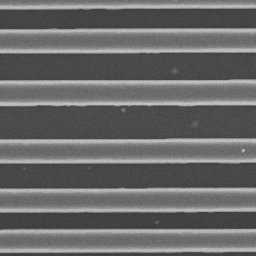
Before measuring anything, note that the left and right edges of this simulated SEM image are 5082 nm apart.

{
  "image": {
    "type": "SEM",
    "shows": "lines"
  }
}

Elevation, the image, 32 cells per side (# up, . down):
################################
................................
................................
................................
################################
################################
################################
................................
................................
................................
################################
################################
################################
................................
................................
................................
................................
################################
################################
################################
................................
................................
................................
................................
################################
################################
###########.##..................
................................
................................
################################
################################
##############..................